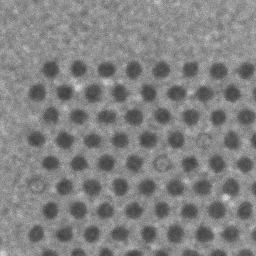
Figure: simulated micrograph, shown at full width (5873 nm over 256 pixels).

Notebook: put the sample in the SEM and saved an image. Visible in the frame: a regular array of ring-shaped grooves with a dot in the middle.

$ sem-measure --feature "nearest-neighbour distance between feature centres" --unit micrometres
0.61